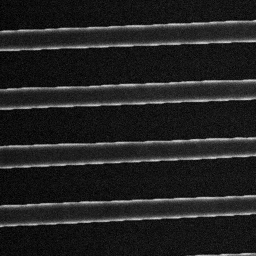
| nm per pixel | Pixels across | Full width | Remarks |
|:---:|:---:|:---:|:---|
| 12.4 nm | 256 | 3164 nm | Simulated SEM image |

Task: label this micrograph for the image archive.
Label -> lines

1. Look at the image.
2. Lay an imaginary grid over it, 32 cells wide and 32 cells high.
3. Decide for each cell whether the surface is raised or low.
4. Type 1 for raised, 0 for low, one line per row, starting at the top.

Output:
00000000000000000000000000000000
00000000000000000000000000000000
00000000000000000000000000000000
00000000000111111111111111111111
11111111111111111111111111111111
11111111111111111111111000000000
00000000000000000000000000000000
00000000000000000000000000000000
00000000000000000000000000000000
00000000000000000000000000000000
00000000000000000011111111111111
11111111111111111111111111111111
11111111111111111111111111111000
11110000000000000000000000000000
00000000000000000000000000000000
00000000000000000000000000000000
00000000000000000000000000000000
00000000000000000000000111111111
11111111111111111111111111111111
11111111111111111111111111111111
11111111111000000000000000000000
00000000000000000000000000000000
00000000000000000000000000000000
00000000000000000000000000000000
00000000000000000000000000000011
00000111111111111111111111111111
11111111111111111111111111111111
11111111111111110000000000000000
00000000000000000000000000000000
00000000000000000000000000000000
00000000000000000000000000000000
00000000000000000000000000000000